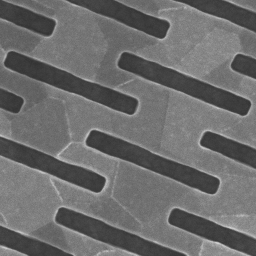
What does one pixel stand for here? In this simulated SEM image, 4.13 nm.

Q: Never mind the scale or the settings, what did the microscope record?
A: holes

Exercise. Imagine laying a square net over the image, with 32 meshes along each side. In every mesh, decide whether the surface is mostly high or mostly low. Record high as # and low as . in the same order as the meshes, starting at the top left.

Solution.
..#######......########......###
....########......#######.......
#......#######......########....
###....##########....#########..
###################..###########
################################
#.##############################
#....##########...###########...
#......########......########...
###......########.......#######.
######......########......######
.########......########......###
...########......########......#
...###########...###########...#
################################
################################
###########..###################
.##########....##########....###
....########......########......
......########......########....
###......########......#######..
#####.......#######......#######
########.....#########.....#####
##########...###########...#####
################################
################################
#######...###########..#########
#######.....#########.....######
.########......#######.......###
...########......########......#
......#######.......########....
###.....########.......#######..